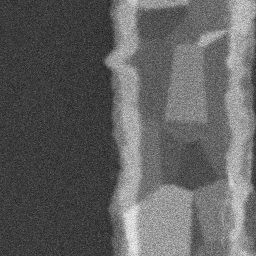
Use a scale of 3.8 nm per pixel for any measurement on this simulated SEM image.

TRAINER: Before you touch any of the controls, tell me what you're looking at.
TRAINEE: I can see one or a few lines or trenches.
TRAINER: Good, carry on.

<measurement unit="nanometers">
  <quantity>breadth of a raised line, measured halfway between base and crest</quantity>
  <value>410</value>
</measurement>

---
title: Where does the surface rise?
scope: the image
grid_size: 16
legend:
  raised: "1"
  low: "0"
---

0000000011111110
0000000011111110
0000000011111110
0000000011111110
0000000011111110
0000000011111110
0000000011111110
0000000011111110
0000000011111110
0000000011111110
0000000011111110
0000000011111110
0000000011111110
0000000011111110
0000000011111110
0000000011111110